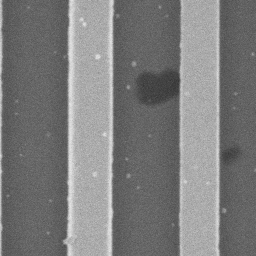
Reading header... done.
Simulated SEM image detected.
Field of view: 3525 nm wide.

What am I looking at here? lines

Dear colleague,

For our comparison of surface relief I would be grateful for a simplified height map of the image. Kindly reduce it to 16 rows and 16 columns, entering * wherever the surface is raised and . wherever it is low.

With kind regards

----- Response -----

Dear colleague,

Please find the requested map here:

....***....***..
....***....***..
....***....***..
....***....***..
....***....***..
....***....***..
....***....***..
....***....***..
....***....***..
....***....***..
....***....***..
....***....***..
....***....***..
....***....***..
....***....***..
....***....***..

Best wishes